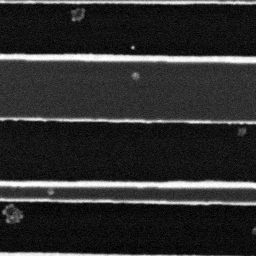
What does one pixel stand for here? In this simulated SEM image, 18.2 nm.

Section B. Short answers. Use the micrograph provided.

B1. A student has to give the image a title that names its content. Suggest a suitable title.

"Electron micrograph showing lines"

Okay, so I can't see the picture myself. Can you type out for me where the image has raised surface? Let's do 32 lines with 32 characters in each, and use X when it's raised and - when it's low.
--------------------------------
--------------------------------
--------------------------------
--------------------------------
--------------------------------
--------------------------------
--------------------------------
XXXXXXXXXXXXXXXXXXXXXXX---X-----
XXXXXXXXXXXXXXXXXXXXXXXXXXXXXXXX
XXXXXXXXXXXXXXXXXXXXXXXXXXXXXXXX
XXXXXXXXXXXXXXXXXXXXXXXXXXXXXXXX
XXXXXXXXXXXXXXXXXXXXXXXXXXXXXXXX
XXXXXXXXXXXXXXXXXXXXXXXXXXXXXXXX
XXXXXXXXXXXXXXXXXXXXXXXXXXXXXXXX
XXXXXXXXXXXXXXXXXXXXXXXXXXXXXXXX
--------------------------------
--------------------------------
--------------------------------
--------------------------------
--------------------------------
--------------------------------
--------------------------------
--------------------------------
XXXXXXXXXXXXXXXXXXXXXXXXXXXXXXXX
XXXXXXXXXXXXXXXXXXXXXXXXXXXXXXXX
--------------------------------
--------------------------------
--------------------------------
--------------------------------
--------------------------------
--------------------------------
--------------------------------